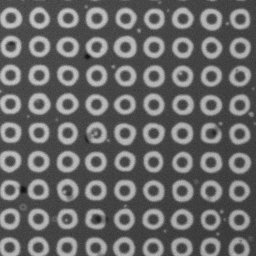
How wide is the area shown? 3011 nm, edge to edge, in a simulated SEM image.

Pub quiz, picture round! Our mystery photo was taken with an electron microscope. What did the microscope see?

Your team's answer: an array of small figures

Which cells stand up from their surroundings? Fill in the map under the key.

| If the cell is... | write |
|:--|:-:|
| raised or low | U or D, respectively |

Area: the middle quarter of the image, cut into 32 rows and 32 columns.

UUDDDDDDUDDDDDDUDDDDDDUUDDDDDDDD
UUUDDDUUUUDDDUUUUUDDDUUUUDDDUUUU
UUUUDDUUUUUDDUUUUUDDUUUUUDDUUUUU
UUUDDDUUUUUDDUUUUUDDUUUUUDDUUUUU
UUUDDDUUUUDDDUUUUUDDUUUUUDDDUUUU
DDDDDDDUUDDDDDDDDDDDDUUUDDDDDUUD
DDDDDDDDDDDDDDDDDDDDDDDDDDDDDDDD
UUDDDDDDDDDDDDDDDDDDDDUDDDDDDDDD
UUUDDDUUUUDDDDUUUDDDUUUUDDDDUUUU
UUUUDUUUUUUDDUUUUUDDUUUUUDDUUUUU
UUUUDUUUUUUDDUUUUUDDUUUUUDDUUUUU
UUUDDDUUUUDDDUUUUUDDUUUUUDDDUUUU
UDDDDDDUUDDDDDUUDDDDDUUUDDDDDUUD
DDDDDDDDDDDDDDDDDDDDDDDDDDDDDDDD
DDDDDDDDDDDDDDDDDDDDDDDDDDDDDDDD
UUUDDDUUUUDDDUUUUDDDUUUUDDDDUUUU
UUUDDDUUUUDDDUUUUUDDUUUUUDDUUUUU
UUUDDDUUUUUDDUUUUUDDUUUUUDDUUUUU
UUUDDDUUUUUDDUUUUUDDUUUUUDDUUUUU
UUDDDDDUUUDDDDUUUDDDDUUUDDDDUUUD
DDDDDDDDDDDDDDDDDDDDDDDDDDDDDDDD
DDDDDDDDDDDDDDDDDDDDDDDDDDDDDDDD
UUUDDDUUUUDDDDUUUDDDDUUUDDDDUUUD
UUUUDDUUUUDDDUUUUUDDUUUUUDDUUUUU
UUUUDUUUUUUDDUUUUUDDUUUUUDDUUUUU
UUUDDDUUUUDDDUUUUDDDUUUUUDDUUUUU
UUDDDDUUUUDDDDUUUDDDDUUUDDDDUUUD
DDDDDDDDDDDDDDDDDDDDDDDDDDDDDDDD
DDDDDDDDDDDDDDDDDDDDDDDDDDDDDDDD
UUUDDDDUUUDDDDUUUDDDDUUUDDDDUUUD
UUUDDDUUUUDDDUUUUUDDUUUUUDDUUUUU
UUUUDUUUUUDDDUUUUUDDUUUUUDDUUUUU